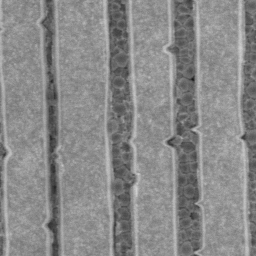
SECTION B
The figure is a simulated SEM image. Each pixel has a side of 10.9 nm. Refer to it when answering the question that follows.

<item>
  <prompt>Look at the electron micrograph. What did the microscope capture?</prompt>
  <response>one or a few lines or trenches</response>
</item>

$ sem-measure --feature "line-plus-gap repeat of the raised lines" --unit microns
0.724